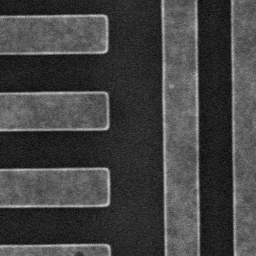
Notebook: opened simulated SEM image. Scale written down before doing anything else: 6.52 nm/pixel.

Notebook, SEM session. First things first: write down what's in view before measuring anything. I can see groups of lines, slits or small figures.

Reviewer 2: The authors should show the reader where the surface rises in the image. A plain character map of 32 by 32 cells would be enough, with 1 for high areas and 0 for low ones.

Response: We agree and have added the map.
00000000000000000000111110000111
00000000000000000000111110000111
11111111111110000000111110000111
11111111111110000000111110000111
11111111111110000000111110000111
11111111111110000000111110000111
11111111111110000000111110000111
00000000000000000000111110000111
00000000000000000000111110000111
00000000000000000000111110000111
00000000000000000000111110000111
00000000000000000000111110000111
11111111111110000000111110000111
11111111111111000000111110000111
11111111111111000000111110000111
11111111111111000000111110000111
00000000000000000000111110000111
00000000000000000000111110000111
00000000000000000000111110000111
00000000000000000000011110000111
00000000000000000000011110000111
11111111111111000000011110000111
11111111111111000000011110000111
11111111111111000000011110000111
11111111111111000000011110000111
11111111111110000000011110000111
00000000000000000000011110000111
00000000000000000000011110000111
00000000000000000000011110000111
00000000000000000000011110000111
00000000000000000000011110000111
11111111111111000000011110000111